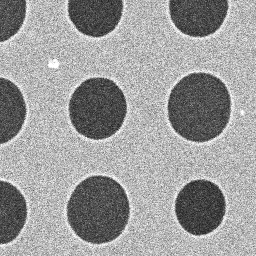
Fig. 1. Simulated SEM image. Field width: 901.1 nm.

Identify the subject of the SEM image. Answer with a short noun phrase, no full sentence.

holes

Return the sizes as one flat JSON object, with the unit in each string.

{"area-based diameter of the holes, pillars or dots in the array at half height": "223 nm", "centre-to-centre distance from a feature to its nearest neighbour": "354 nm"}